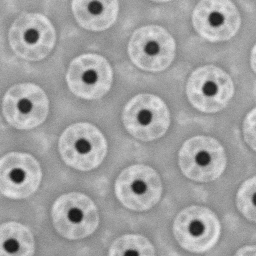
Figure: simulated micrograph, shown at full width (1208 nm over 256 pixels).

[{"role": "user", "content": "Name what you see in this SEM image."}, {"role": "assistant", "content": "a regular array of ring-shaped raised bodies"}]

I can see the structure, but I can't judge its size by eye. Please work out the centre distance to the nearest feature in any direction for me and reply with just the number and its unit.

327 nanometers